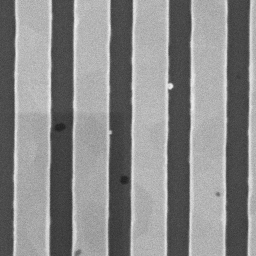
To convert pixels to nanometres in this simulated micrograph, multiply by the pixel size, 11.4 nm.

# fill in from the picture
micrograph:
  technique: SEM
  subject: wiring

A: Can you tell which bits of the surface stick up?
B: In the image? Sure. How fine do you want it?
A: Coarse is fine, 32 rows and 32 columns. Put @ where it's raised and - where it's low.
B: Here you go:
--@@@@---@@@@@---@@@@---@@@@---@
--@@@@---@@@@@---@@@@---@@@@---@
--@@@@---@@@@@---@@@@---@@@@---@
--@@@@---@@@@@---@@@@---@@@@---@
--@@@@---@@@@@---@@@@---@@@@---@
--@@@@---@@@@@---@@@@---@@@@---@
--@@@@---@@@@@---@@@@---@@@@---@
--@@@@---@@@@@---@@@@---@@@@---@
--@@@@---@@@@@---@@@@---@@@@---@
--@@@@---@@@@@---@@@@---@@@@---@
--@@@@---@@@@@---@@@@---@@@@---@
--@@@@---@@@@@---@@@@---@@@@---@
--@@@@---@@@@@---@@@@---@@@@---@
--@@@@---@@@@@---@@@@---@@@@---@
--@@@@---@@@@@---@@@@---@@@@---@
--@@@@---@@@@@---@@@@---@@@@---@
--@@@@---@@@@@---@@@@---@@@@---@
--@@@@---@@@@@---@@@@---@@@@---@
--@@@@---@@@@@---@@@@---@@@@---@
--@@@@---@@@@@---@@@@---@@@@---@
--@@@@---@@@@@---@@@@---@@@@---@
--@@@@---@@@@@---@@@@---@@@@---@
--@@@@---@@@@@---@@@@---@@@@---@
--@@@@---@@@@@--@@@@@---@@@@---@
--@@@@---@@@@@--@@@@@---@@@@---@
--@@@@---@@@@@--@@@@@---@@@@---@
--@@@@---@@@@@--@@@@@---@@@@---@
--@@@@---@@@@@--@@@@@---@@@@---@
--@@@@---@@@@---@@@@@---@@@@---@
--@@@@---@@@@---@@@@@---@@@@---@
--@@@@---@@@@---@@@@@---@@@@---@
--@@@@---@@@@---@@@@@---@@@@---@